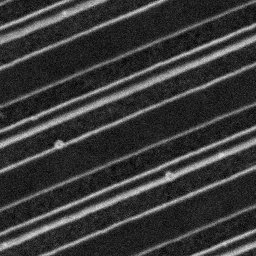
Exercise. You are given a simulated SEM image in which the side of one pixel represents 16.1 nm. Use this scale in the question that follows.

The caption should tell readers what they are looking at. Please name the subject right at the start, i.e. lines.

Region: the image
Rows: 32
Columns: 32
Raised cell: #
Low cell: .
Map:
.......#####.......############.
.....####........############...
..#####.......############......
####........############.......#
##.......#############.......###
.......############.......#####.
....#############.......####....
..############.......#####......
############.......####.......##
#########.......#####.......####
#######.......#####.......######
#####.......####.......#########
##.......#####.......###########
.......####.......#############.
....#####.......############....
..#####.......############......
####.......#############......##
##.......############.......####
.......############.......####..
....############.......#####....
..############.......####.......
############.......####.......##
#########.......#####.......####
#######.......####.......#######
####.......#####.......#########
##.......#####.......###########
.......####.......############..
....#####.......############....
..####........############......
####.......############.......##
#........############.......####
......############.......#####..